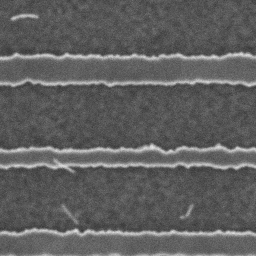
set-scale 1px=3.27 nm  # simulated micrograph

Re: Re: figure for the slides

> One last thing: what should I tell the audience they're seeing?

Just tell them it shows lines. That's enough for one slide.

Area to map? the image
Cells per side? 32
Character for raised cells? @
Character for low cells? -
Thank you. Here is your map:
--------------------------------
--------------------------------
--------------------------------
--------------------------------
--------------------------------
--------------------------------
--------------------------------
@@@@@@@@@@@@@@@@@@@@@@@@@@@@@@@@
@@@@@@@@@@@@@@@@@@@@@@@@@@@@@@@@
@@@@@@@@@@@@@@@@@@@@@@@@@@@@@@@@
@@@--@@@@----@@@----@@--------@@
--------------------------------
--------------------------------
--------------------------------
--------------------------------
--------------------------------
--------------------------------
--------------------------------
------------------@@--@@---@----
@@@@@@@@@@@@@@@@@@@@@@@@@@@@@@@@
@@@@@@@@@@@@@@@@@@@@@@@@@@@@@@@@
--------------------------------
--------------------------------
--------------------------------
--------------------------------
--------------------------------
--------------------------------
--------------------------------
--------------------------------
@@@@@@@@@@@@@@@@@@@@@@@@@@@@@@@@
@@@@@@@@@@@@@@@@@@@@@@@@@@@@@@@@
@@@@@@@@@@@@@@@@@@@@@@@@@@@@@@@@